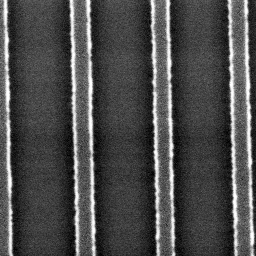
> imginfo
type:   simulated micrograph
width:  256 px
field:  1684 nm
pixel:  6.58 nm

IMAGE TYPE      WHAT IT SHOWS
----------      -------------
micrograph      lines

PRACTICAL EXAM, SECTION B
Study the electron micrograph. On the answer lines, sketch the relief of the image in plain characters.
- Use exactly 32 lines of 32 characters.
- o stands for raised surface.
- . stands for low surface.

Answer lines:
o........oo........oo........oo.
o........oo........oo........oo.
o........oo........oo........oo.
o........oo........oo........oo.
o........oo........oo........oo.
o........oo........oo........oo.
o........oo........oo........oo.
o........oo........oo........oo.
o........oo........oo........oo.
o........oo........oo........oo.
o........oo........oo........oo.
o........oo........oo........oo.
o........oo........oo........oo.
o........oo........oo........oo.
o........oo........oo........oo.
o........oo........oo........oo.
o........oo........oo........oo.
o........oo........oo........oo.
o........oo........oo........oo.
o........oo........oo........oo.
o........ooo........o........oo.
o........ooo........o........oo.
o........ooo.......oo........oo.
o........ooo........oo.......oo.
o........ooo........oo.......oo.
o........ooo........oo.......ooo
o.........oo........oo.......oo.
o........ooo........oo.......ooo
o.........oo........oo.......ooo
o.........oo........oo.......ooo
o.........oo........oo.......ooo
o.........oo........oo.......ooo